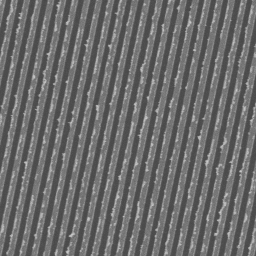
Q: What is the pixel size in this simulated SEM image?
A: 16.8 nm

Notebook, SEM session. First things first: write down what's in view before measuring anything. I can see parallel lines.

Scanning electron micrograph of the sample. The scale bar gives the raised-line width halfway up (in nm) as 107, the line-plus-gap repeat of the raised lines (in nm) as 199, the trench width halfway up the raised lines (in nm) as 90.7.